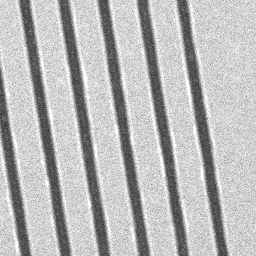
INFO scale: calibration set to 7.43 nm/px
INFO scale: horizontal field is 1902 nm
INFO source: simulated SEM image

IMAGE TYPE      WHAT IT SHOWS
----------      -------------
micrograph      parallel lines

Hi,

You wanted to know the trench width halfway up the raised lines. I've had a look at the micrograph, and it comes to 80.7 nanometres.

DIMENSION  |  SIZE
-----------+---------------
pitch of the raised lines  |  289 nm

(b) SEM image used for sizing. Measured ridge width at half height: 207 nm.